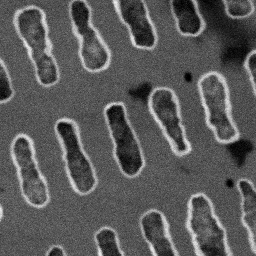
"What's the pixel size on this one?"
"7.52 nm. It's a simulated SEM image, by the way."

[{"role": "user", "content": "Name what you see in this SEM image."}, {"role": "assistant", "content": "holes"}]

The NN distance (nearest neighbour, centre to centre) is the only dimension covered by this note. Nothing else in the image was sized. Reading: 375 nm